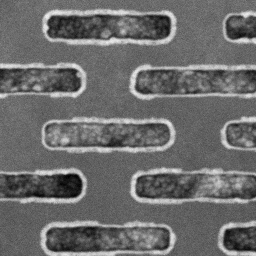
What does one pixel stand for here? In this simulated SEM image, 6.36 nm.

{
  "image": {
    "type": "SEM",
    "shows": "holes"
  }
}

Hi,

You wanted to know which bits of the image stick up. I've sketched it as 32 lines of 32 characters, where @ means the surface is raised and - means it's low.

@@@@@@@@@@@@@@@@@@@@@@@@@@@@@@@@
@@@@@@@@@@@@@@@@@@@@@@@@@@@@@@@@
@@@@@@---------------@@@@@@@----
@@@@@@----------------@@@@@@----
@@@@@@---------------@@@@@@@----
@@@@@@@@@@@@@@@@@@@@@@@@@@@@@@@@
@@@@@@@@@@@@@@@@@@@@@@@@@@@@@@@@
@@@@@@@@@@@@@@@@@@@@@@@@@@@@@@@@
---------@@@@@@@@@@----@@@-@@@-@
----------@@@@@@@---------------
----------@@@@@@@---------------
----------@@@@@@@---------------
@@@@@@@@@@@@@@@@@@@@@@@@@@@@@@@@
@@@@@@@@@@@@@@@@@@@@@@@@@@@@@@@@
@@@@@@@@@@@@@@@@@@@@@@@@@@@@@@@@
@@@@@@---------------@@@@@@@----
@@@@@----------------@@@@@@@----
@@@@@----------------@@@@@@@----
@@@@@@---------@@@-@@@@@@@@@@---
@@@@@@@@@@@@@@@@@@@@@@@@@@@@@@@@
@@@@@@@@@@@@@@@@@@@@@@@@@@@@@@@@
@@@@@@@@@@@@@@@@@@@@@--@-@@@@@@@
----------@@@@@@@---------------
----------@@@@@@@---------------
----------@@@@@@@---------------
@@@@@@@@@@@@@@@@@@@@@@@@@@@@@@@@
@@@@@@@@@@@@@@@@@@@@@@@@@@@@@@@@
@@@@@@@@@@@@@@@@@@@@@@@@@@@@@@@@
@@@@@@---------------@@@@@@@@---
@@@@@@---------------@@@@@@@----
@@@@@@---------------@@@@@@@----
@@@@@@@-------@@@-@@@@@@@@@@@---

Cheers